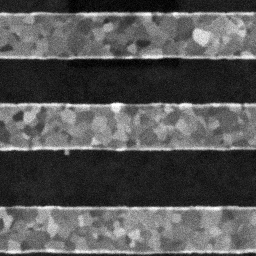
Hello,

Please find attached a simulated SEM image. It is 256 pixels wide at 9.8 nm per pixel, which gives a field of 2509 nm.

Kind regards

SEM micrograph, lines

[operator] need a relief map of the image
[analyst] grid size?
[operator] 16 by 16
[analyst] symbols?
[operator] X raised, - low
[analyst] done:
----------------
XXXXXXXXXXXXXXXX
XXXXXXXXXXXXXXXX
XXXXXXXXXXXXXXXX
----------------
----------------
----------------
XXXXXXXXXXXXXXXX
XXXXXXXXXXXXXXXX
----------------
----------------
----------------
----------------
XXXXXXXXXXXXXXXX
XXXXXXXXXXXXXXXX
XXXXXXXXXXXXXXXX